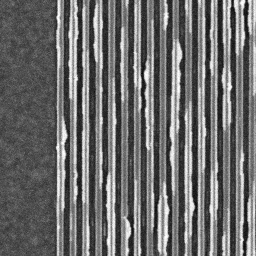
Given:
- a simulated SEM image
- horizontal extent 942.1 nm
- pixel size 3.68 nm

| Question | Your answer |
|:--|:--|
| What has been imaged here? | parallel lines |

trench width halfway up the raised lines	6.49	px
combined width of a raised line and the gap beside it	12.8	px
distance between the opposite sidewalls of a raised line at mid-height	6.49	px